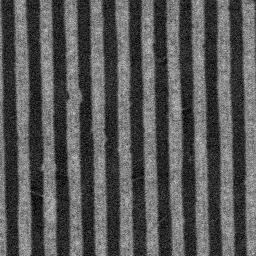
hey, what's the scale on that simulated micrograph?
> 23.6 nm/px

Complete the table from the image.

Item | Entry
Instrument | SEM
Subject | parallel lines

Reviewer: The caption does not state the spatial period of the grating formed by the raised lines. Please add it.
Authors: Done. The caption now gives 598 nanometers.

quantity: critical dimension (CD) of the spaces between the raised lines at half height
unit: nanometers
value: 345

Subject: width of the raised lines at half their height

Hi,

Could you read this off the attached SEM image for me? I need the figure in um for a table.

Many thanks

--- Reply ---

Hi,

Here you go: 0.251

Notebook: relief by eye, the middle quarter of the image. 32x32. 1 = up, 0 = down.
01100001110001110000110000110000
01100001110000110000110000111000
01100001110000110000110000111000
01100001110000110000110000111000
01100001110000110000110000111000
01100001110000110000110000111000
01110001110000110000110000111000
01110001110000110000110000111000
00110001110000110000110000111000
01110001110000110000110000111000
01100001110000110000110000011000
01100001110000110000110000011000
01110001110000110000111000011000
01110001110000110000111000111000
01110001110000110000111000111000
01110001110000110000110000111000
01110001110000110000011000111000
01110000110000110000111000111000
01110000110000110000111000111000
01110000110000110000111000111000
01110000110000110000111000111000
01110000110000110000111000111000
01110000110000111000111000011000
01110000110000111000111000011000
01110000110000111000111000011000
01110000110000111000111000011000
01110000110000111000111000011000
01110000110000111000111000011000
01110000110000110000111000011000
01110000110000111000111000011000
01110000110000110000111000011000
00110000110000111000011000011000